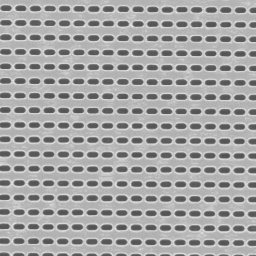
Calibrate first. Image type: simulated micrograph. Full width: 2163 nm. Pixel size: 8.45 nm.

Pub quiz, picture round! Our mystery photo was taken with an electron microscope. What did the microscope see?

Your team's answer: a regular array of holes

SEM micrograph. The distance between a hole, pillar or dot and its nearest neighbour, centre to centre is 119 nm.